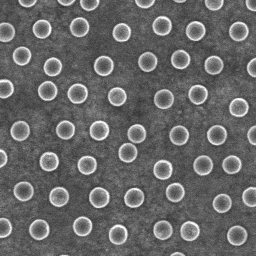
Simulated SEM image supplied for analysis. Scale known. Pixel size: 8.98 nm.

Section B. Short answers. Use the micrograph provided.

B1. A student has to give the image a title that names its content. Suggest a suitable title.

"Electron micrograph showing a regular array of raised bodies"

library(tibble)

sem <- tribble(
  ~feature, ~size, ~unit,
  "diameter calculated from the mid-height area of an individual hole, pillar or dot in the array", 168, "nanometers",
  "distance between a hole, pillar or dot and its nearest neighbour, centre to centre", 301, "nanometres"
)